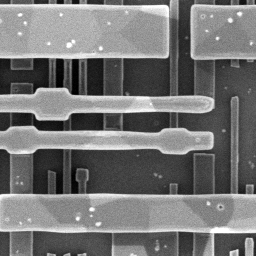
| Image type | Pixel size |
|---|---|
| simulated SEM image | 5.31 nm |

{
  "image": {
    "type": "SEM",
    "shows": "wiring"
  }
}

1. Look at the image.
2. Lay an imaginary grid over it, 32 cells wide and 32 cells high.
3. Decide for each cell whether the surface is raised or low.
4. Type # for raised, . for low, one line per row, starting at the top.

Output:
................................
#####################...########
#####################...########
#####################...########
#####################...########
#####################...########
#####################...########
................................
................................
................................
................................
....#####.......................
###########################.....
###########################.....
....#####.......................
................................
#################..#######......
###########################.....
#####..###########.#######......
................................
................................
................................
................................
................................
################################
################################
################################
################################
################################
................................
................................
................................